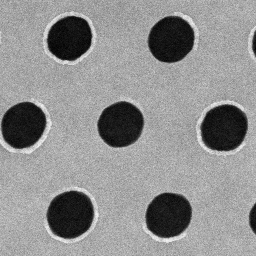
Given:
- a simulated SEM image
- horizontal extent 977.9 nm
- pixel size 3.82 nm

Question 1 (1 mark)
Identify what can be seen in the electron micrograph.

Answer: holes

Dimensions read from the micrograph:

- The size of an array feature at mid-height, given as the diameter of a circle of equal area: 0.172 microns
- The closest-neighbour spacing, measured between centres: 0.375 micrometres